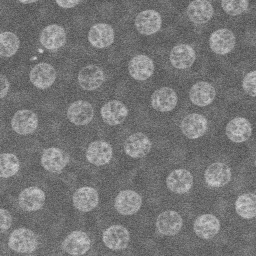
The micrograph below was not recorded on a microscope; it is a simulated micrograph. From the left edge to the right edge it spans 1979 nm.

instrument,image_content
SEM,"a regular array of raised bodies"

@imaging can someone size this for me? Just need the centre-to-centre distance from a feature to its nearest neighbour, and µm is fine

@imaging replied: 0.302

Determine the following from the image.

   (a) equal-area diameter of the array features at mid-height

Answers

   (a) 0.179 microns